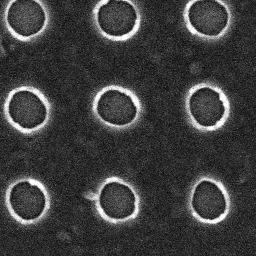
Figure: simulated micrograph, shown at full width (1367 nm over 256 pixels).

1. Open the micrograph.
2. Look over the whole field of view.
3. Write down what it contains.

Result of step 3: holes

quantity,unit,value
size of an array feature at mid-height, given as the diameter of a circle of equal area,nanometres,198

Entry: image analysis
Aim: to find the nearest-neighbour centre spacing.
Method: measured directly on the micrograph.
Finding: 90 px